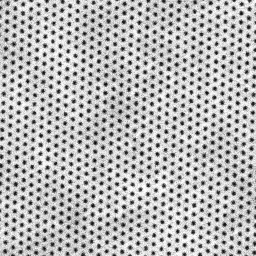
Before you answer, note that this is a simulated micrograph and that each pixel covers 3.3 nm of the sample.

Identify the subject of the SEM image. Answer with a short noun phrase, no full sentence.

a regular array of holes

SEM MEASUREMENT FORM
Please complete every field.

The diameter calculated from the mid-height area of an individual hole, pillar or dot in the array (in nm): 14.9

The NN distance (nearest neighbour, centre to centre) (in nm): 28.9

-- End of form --